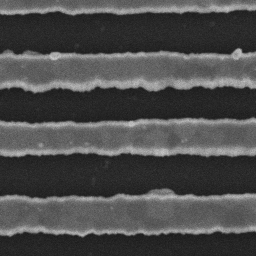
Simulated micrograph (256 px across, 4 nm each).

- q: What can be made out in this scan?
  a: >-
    lines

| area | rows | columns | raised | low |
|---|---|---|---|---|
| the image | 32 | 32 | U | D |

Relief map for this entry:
UUUUUUUUUUUUUUUUUUUUUUUUUUUUUUUU
UUUUUUDDUUUUUUUUUUDDDDUDDUDDDDDD
DDDDDDDDDDDDDDDDDDDDDDDDDDDDDDDD
DDDDDDDDDDDDDDDDDDDDDDDDDDDDDDDD
DDDDDDDDDDDDDDDDDDDDDDDDDDDDDDDD
DDDDDDDDDDDDDDDDDDDDDDDDDDDDDDDD
DDDDDDDDDDDDDDDDDDDDDDDDDDDDDUDD
UUUUUUUUUUUUUUUUUUUUUUUUUUUUUUUU
UUUUUUUUUUUUUUUUUUUUUUUUUUUUUUUU
UUUUUUUUUUUUUUUUUUUUUUUUUUUUUUUU
UUUUUUUUUUUUUUUUUUUUUUUUUUUUUUUU
DDDDDDDDDDDDDDDDDDDDDDDDDDDDDDDD
DDDDDDDDDDDDDDDDDDDDDDDDDDDDDDDD
DDDDDDDDDDDDDDDDDDDDDDDDDDDDDDDD
DDDDDDDDDDDDDDDDDDDDDDDDDDDDDDDD
UUUDDDDUUUDUUUUUUUUUUUUUUUUUUUUU
UUUUUUUUUUUUUUUUUUUUUUUUUUUUUUUU
UUUUUUUUUUUUUUUUUUUUUUUUUUUUUUUU
UUUUUUUUUUUUUUUUUUUUUUUUUUUUUUUU
DDDDDDDDDDDDDDDDDDDDDDDDDDDDDDDD
DDDDDDDDDDDDDDDDDDDDDDDDDDDDDDDD
DDDDDDDDDDDDDDDDDDDDDDDDDDDDDDDD
DDDDDDDDDDDDDDDDDDDDDDDDDDDDDDDD
DDDDDDDDDDDDDDDDDDDDDDDDDDDDDDDD
DDDDDDDDDDDDDDUUDUUUDUDUDDDDUUUU
UUUUUUUUUUUUUUUUUUUUUUUUUUUUUUUU
UUUUUUUUUUUUUUUUUUUUUUUUUUUUUUUU
UUUUUUUUUUUUUUUUUUUUUUUUUUUUUUUU
UUUUUUUUUUUUUUUUUUUUUUUUUUUUUUUU
DDDDDDDDDDUDDDDDDDDDDDDDDDDDDDDD
DDDDDDDDDDDDDDDDDDDDDDDDDDDDDDDD
DDDDDDDDDDDDDDDDDDDDDDDDDDDDDDDD